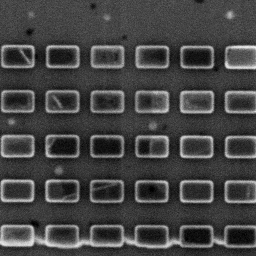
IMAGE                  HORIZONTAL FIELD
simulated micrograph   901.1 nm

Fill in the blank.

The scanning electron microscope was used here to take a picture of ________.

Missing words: wiring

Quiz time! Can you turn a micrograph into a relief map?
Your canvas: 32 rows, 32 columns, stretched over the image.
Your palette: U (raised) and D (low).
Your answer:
DDDDDDDDDDDDDDDDDDDDDDDDDDDDDDDD
DDDDDDDDDDDDDDDDDDDDDDDDDDDDDDDD
DDDDDDDDDDDDDDDDDDDDDDDDDDDDDDDD
DDDDDDDDDDDDDDDDDDDDDDDDDDDDDDDD
DDDDDDDDDDDDDDDDDDDDDDDDDDDDDDDD
DDDDDDDDDDDDDDDDDDDDDDDDDDDDDDDD
UUUUDDUUUUDDUUUDDUUUUDDUUUUDUUUU
UUUUDDUUUUDDUUUDDUUUUDDUUUUDUUUU
DDDDDDDDDDDDDDDDDDDDDDDDDDDDDUUU
DDDDDDDDDDDDDDDDDDDDDDDDDDDDDDDD
DDDDDDDDDDDDDDDDDDDDDDDDDDDDDDDD
DUUUDDUUUDDDUUDDDDDDDDDDDDDDDDDD
UUUUDDUUUUDUUUUDDUUUUDDUUUUDUUUU
UUUUDDUUUUDUUUUDDUUUUDDUUUUDUUUU
DDDDDDDDDDDDDDDDDDDDDDDDDDDDDDDD
DDDDDDDDDDDDDDDDDDDDDDDDDDDDDDDD
DDDDDDDDDDDDDDDDDDDDDDDDDDDDDDDD
UUUUDDUUUUDUUUUDDUUUUDDUUUDDUUUU
UUUUDDUUUUDUUUUDDUUUUDDUUUUDUUUU
DUUUDDUUUUDDUUUDDUUUUDDUUUDDUUUU
DDDDDDDDDDDDDDDDDDDDDDDDDDDDDDDD
DDDDDDDDDDDDDDDDDDDDDDDDDDDDDDDD
DDDDDDDDDDDDDDDDDDDDDDDDDDDDDDDD
UUUUDDUUUUDUUUUDDUUUUDDUUUUDUUUU
UUUUDDUUUUDUUUUDDUUUUDDUUUDDUUUU
DDDDDDDDDDDDDDDDDDDDDDDDDDDDDDDD
DDDDDDDDDDDDDDDDDDDDDDDDDDDDDDDD
DDDDDDDDDDDDDDDDDDDDDDDDDDDDDDDD
UUUUDDUUUUDDUUUDDUUUUDDUUUDDUUUU
UUUUDDUUUUDUUUUDDUUUUDDUUUUDUUUU
DDDDDDDDUDDDUUUDDUUUUDDUUUDDUUUU
DDDDDDDDDDDDDDDDDDDDDDDDDDDDDDDD